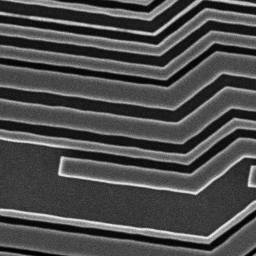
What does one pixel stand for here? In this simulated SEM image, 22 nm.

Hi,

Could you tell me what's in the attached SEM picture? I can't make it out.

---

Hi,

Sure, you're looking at groups of lines, slits or small figures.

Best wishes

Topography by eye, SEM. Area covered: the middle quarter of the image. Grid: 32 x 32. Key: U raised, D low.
DUUUUUUUUUUUUUUUUUUUUUDDDUUUUUDD
DDDDDDDUUUUUUUUUUUUUUUUUUUUUUDDD
UDDDDDDDDDDDDDUUUUUUUUUUUUUDDDDU
UUUUUUUUDDDDDDDDDDDDDUUUUUDDDUUU
UUUUUUUUUUUUUUUDDDDDDDDDDDDDUUUU
UUUUUUUUUUUUUUUUUUUUUUUUDDUUUUUU
UUUUUUUUUUUUUUUUUUUUUUUUUUUUUUUU
UUUUUUUUUUUUUUUUUUUUUUUUUUUUUUUU
DDDDDUUUUUUUUUUUUUUUUUUUUUUUUUUU
DDDDDDDDDDDDUUUUUUUUUUUUUUUUUUDD
DDDDDDDDDDDDDDDDDDDDUUUUUUUUUDDD
UUUUDDDDDDDDDDDDDDDDDDDDDDDDDDDD
UUUUUUUUUUUDDDDDDDDDDDDDDDDDDDDD
UUUUUUUUUUUUUUUUUUDDDDDDDDDDDDUU
UUUUUUUUUUUUUUUUUUUUUUUUUDDDDUUU
UUUUUUUUUUUUUUUUUUUUUUUUUUUUUUUU
DDDDDUUUUUUUUUUUUUUUUUUUUUUUUUUU
DDDDDDDDDDDUUUUUUUUUUUUUUUUUUUUU
DDDDDDDDDDDDDDDDDDUUUUUUUUUUUUUU
UUUUUUDDDDDDDDDDDDDDDDDDDUUUUUDD
UUUUUUUUUUUUDDDDDDDDDDDDDDDDDDDD
DDDDUUUUUUUUUUUUUUUUDDDDDDDDDDDD
DDDDDDDDDDDDDUUUUUUUUUUUUUUUUDUU
UDDDDDDDDDDDDDDDDDDDUUUUUUUUUUUU
UUUUUUUUUDDDDDDDDDDDDDDDDDDUUUUU
UUUUUUUUUUUUUUUDDDDDDDDDDDDDDDDD
UUUUUUUUUUUUUUUUUUUUUUUDDDDDDDDD
UUUUUUUUUUUUUUUUUUUUUUUUUUUUUUDD
DDDDDUUUUUUUUUUUUUUUUUUUUUUUUUUU
DDDDDDDDDDDUUUUUUUUUUUUUUUUUUUUU
DDDDDDDDDDDDDDDDDDDDUUUUUUUUUUUU
DDDDDDDDDDDDDDDDDDDDDDDDDDDUUUUU